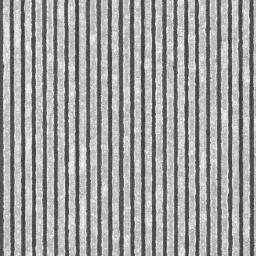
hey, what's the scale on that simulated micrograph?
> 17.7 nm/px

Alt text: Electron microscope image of parallel lines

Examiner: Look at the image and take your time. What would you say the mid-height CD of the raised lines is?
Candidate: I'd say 110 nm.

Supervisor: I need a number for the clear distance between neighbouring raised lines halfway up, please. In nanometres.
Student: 79.6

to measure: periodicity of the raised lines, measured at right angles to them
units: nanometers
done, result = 192